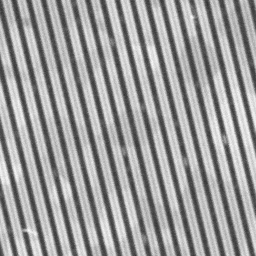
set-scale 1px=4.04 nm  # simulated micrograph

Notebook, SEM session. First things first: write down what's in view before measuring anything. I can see parallel lines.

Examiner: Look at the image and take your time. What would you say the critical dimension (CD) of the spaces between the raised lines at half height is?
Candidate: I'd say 8.27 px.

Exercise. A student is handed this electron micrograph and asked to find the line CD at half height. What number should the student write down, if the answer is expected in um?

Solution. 0.0271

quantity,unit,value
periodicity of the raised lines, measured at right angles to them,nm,58.2